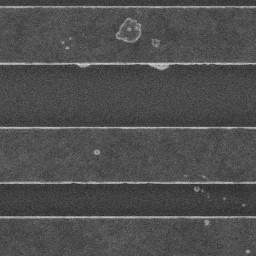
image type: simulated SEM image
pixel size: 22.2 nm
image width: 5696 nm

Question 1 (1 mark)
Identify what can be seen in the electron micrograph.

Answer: lines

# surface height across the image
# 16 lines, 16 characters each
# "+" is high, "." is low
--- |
++++++++++++++++
++++++++++++++++
++++++++++++++++
++++++++++++++++
................
................
................
................
++++++++++++++++
++++++++++++++++
++++++++++++++++
................
................
................
++++++++++++++++
++++++++++++++++